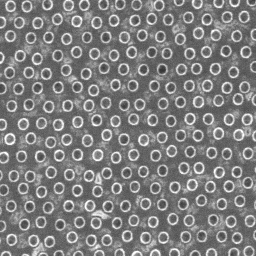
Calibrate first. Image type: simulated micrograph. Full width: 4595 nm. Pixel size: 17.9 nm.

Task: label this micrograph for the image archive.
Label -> a regular array of raised bodies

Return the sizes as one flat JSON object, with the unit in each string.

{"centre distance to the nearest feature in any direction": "302 nanometres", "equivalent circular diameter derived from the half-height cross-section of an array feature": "0.188 um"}